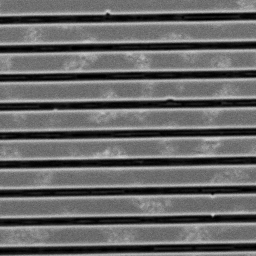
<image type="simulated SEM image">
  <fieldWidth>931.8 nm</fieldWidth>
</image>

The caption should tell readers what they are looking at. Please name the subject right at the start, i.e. parallel lines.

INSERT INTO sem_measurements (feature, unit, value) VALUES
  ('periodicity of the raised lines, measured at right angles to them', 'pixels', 28.9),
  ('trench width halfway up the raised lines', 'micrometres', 0.0292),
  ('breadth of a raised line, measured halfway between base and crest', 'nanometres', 75.6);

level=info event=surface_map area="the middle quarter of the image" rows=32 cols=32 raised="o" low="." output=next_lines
oooooooooooooooooooooooooooooooo
oooooooooooooooooooooooooooooooo
................................
................................
oooooooooooooooooooooooooooooooo
oooooooooooooooooooooooooooooooo
oooooooooooooooooooooooooooooooo
oooooooooooooooooooooooooooooooo
oooooooooooooooooooooooooooooooo
o...............................
................................
...ooooooooooooooooooooooooooooo
oooooooooooooooooooooooooooooooo
oooooooooooooooooooooooooooooooo
oooooooooooooooooooooooooooooooo
oooooooooooooooooooooooooooooooo
oooooooooooo....................
................................
...................ooooooooooooo
oooooooooooooooooooooooooooooooo
oooooooooooooooooooooooooooooooo
oooooooooooooooooooooooooooooooo
oooooooooooooooooooooooooooooooo
oooooooooooooooooooooooo........
................................
................................
oooooooooooooooooooooooooooooooo
oooooooooooooooooooooooooooooooo
oooooooooooooooooooooooooooooooo
oooooooooooooooooooooooooooooooo
oooooooooooooooooooooooooooooooo
................................